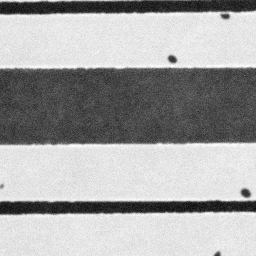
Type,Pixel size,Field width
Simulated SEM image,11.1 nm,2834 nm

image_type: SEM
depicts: lines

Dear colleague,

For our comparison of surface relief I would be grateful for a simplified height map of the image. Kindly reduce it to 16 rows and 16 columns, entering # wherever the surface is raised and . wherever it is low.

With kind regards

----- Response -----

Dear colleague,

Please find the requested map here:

................
################
################
################
................
................
................
................
................
################
################
################
################
################
################
################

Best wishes